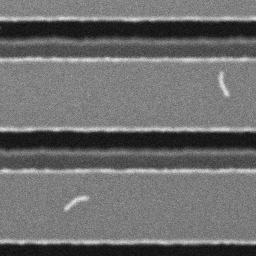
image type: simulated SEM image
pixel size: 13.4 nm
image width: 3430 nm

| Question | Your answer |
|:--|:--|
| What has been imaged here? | lines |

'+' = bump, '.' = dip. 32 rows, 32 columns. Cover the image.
++++++++++++++++++++++++++++++++
++++++++++++++++++++++++++++++++
.+....+...++...+++.+............
................................
................................
++++++++++++++++++++++++++++++++
++++++++++++++++++++++++++++++++
++++++++++++++++++++++++++++++++
++++++++++++++++++++++++++++++++
++++++++++++++++++++++++++++++++
++++++++++++++++++++++++++++++++
++++++++++++++++++++++++++++++++
++++++++++++++++++++++++++++++++
++++++++++++++++++++++++++++++++
++++++++++++++++++++++++++++++++
++++++++++++++++++++++++++++++++
................................
................................
................................
++++++++++++++++++++++++++++++++
++++++++++++++++++++++++++++++++
++++++++++++++++++++++++++++++++
++++++++++++++++++++++++++++++++
++++++++++++++++++++++++++++++++
++++++++++++++++++++++++++++++++
++++++++++++++++++++++++++++++++
++++++++++++++++++++++++++++++++
++++++++++++++++++++++++++++++++
++++++++++++++++++++++++++++++++
++++++++++++++++++++++++++++++++
................................
................................